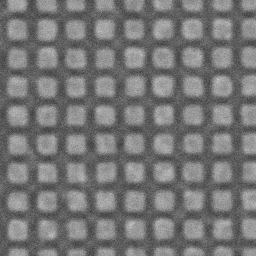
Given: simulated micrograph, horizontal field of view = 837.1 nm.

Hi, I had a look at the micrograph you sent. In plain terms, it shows a regular array of raised bodies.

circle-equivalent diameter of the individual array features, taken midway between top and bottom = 64.7 nm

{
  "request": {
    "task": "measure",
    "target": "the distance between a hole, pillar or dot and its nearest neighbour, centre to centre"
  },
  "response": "28.3 pixels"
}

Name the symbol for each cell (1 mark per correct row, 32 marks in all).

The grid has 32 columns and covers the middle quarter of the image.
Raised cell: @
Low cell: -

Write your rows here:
-@@@@---@@@@----@@@----@@@@----@
--------------------------------
--------------------------------
---------@@-----@@@----@@------@
-@@@@---@@@@----@@@@---@@@@---@@
-@@@@---@@@@@---@@@@---@@@@---@@
-@@@@---@@@@@---@@@@---@@@@---@@
-@@@@---@@@@----@@@@---@@@@---@@
--------------------------------
--------------------------------
--------------------------------
-@@@@---@@@@----@@@@---@@@@---@@
-@@@@---@@@@----@@@@---@@@@---@@
-@@@@---@@@@----@@@@---@@@@---@@
-@@@@---@@@@----@@@@---@@@@---@@
--------------------------------
--------------------------------
--------------------------------
-@@@@---@@@@----@@@@---@@@@---@@
-@@@@---@@@@----@@@@---@@@@---@@
-@@@@---@@@@----@@@@---@@@@---@@
-@@@@---@@@@----@@@@---@@@@---@@
--------------------------------
--------------------------------
--------------------------------
-@@@@---@@@@----@@@@---@@@@---@@
-@@@@---@@@@----@@@@---@@@@---@@
-@@@@---@@@@----@@@@---@@@@---@@
-@@@@---@@@@----@@@@---@@@@---@@
--------------------------------
--------------------------------
--------------------------------